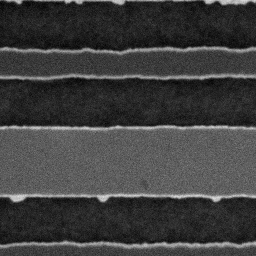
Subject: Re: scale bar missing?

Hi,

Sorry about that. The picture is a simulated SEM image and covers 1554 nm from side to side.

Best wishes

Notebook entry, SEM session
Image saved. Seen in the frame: lines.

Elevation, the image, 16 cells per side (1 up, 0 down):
0000000000000000
0000000000000000
0000000000000000
1111111111111111
1111111111111111
0000000000000000
0000000000000000
0000000000000000
1111111111111111
1111111111111111
1111111111111111
1111111111111111
0000000000000000
0000000000000000
0000000000000000
1111111111111111